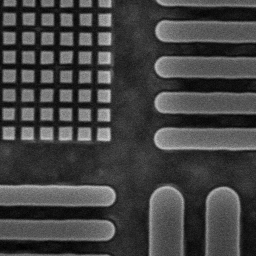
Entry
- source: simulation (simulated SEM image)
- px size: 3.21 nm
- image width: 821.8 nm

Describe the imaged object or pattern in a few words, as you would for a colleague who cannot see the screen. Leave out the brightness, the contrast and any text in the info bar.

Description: groups of lines, slits or small figures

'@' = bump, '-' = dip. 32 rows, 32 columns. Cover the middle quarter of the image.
-----------------------@@@@@@@@@
-----------------------@@@@@@@@@
@@--@@---@@-------------@@@@@@@@
@@--@@---@@---------------------
-@--@@---@@---------------------
--------------------------------
--------------------------------
@@--@@--@@@-------------@@@@@@@@
@@--@@--@@@------------@@@@@@@@@
-----------------------@@@@@@@@@
-----------------------@@@@@@@@@
@@--@@---@@------------@@@@@@@@@
@@--@@---@@---------------------
@@--@@--@@@---------------------
--------------------------------
--------------------------------
@@--@@--@@@-------------@@@@@@@@
@@--@@--@@@------------@@@@@@@@@
@@--@@--@@@------------@@@@@@@@@
-----------------------@@@@@@@@@
-----------------------@@@@@@@@@
--------------------------------
--------------------------------
--------------------------------
--------------------------------
--------------------------------
--------------------------------
--------------------------------
--------------------------------
--------------------------------
--------------------------------
@@@@@@@@@@@@-----------@@@@@----